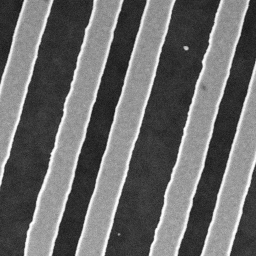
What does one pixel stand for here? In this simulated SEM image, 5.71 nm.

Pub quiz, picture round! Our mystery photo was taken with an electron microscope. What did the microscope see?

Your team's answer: lines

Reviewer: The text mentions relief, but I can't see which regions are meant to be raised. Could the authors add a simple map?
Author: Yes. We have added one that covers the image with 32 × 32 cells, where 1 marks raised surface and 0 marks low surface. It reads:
00011100000011100011110000011110
00011100000011100011100000011110
00111100000111100011100000011100
00111100000111000111100000011100
00111000000111000111100000111100
01111000001111000111000000111100
01111000001111000111000000111000
01110000001110001111000001111000
01110000001110001111000001111000
11110000011110001110000001111001
11110000011100011110000011110001
11100000011100011110000011110001
11100000111100011110000011110001
11100000111100111100000011100011
11100000111000111100000011100011
11000000111000111100000111100011
11000001111000111000000111100011
11000001111000111000000111000111
10000001110001111000001111000111
10000011110001110000001111000111
10000011110001110000001111001111
00000011100011110000001110001111
00000011100011110000011110001110
00000111100011100000011110001110
00000111100111100000011100011110
00000111000111100000111100011100
00001111000111000000111100011100
00001111000111000000111100111100
00001110001111000000111000111100
00011110001111000001111000111000
00011110001110000001111000111000
00011110001110000001110001111000